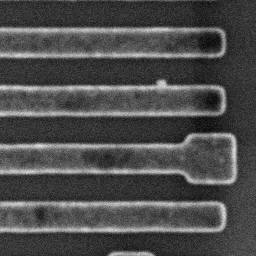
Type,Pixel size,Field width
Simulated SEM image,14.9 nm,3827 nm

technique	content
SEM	wiring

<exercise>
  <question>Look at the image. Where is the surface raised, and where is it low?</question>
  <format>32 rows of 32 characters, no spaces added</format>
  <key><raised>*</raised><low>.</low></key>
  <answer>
................................
................................
................................
................................
****************************....
****************************....
****************************....
................................
................................
................................
................................
****************************....
****************************....
****************************....
................................
................................
................................
.......................******...
*****************************...
*****************************...
*****************************...
*****************************...
........................*****...
................................
................................
****************************....
****************************....
****************************....
****************************....
................................
................................
................................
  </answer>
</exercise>